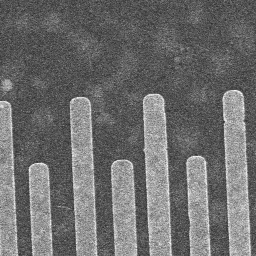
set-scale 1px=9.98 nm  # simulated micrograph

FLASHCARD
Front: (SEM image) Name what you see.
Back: parallel lines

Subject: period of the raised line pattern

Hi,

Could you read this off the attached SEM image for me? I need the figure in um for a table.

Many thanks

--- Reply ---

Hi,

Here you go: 0.388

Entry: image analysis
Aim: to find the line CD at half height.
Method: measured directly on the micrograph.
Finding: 203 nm